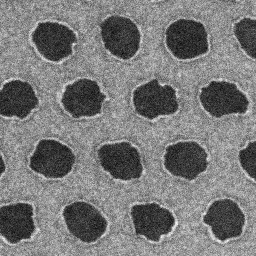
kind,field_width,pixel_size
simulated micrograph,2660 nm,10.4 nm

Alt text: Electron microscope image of a regular array of raised bodies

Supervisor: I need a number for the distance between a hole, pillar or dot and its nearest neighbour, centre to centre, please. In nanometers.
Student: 694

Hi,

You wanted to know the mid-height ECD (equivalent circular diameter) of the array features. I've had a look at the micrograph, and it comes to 456 nm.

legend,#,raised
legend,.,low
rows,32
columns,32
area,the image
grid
................................
................................
.............###......##......##
....#####...#####....#####...###
....######..######...#####...###
....#####....#####...#####....##
.....####.....###....#####....##
......##.......#......##........
................................
................................
####....####......##......###...
####....#####....#####...######.
#####...#####....#####...######.
#####...#####....#####...######.
####.....###.....####.....##....
................................
................................
.....##.........................
....#####...#####....#####....##
....#####...######..######....##
#...#####...######..######....##
#...#####....#####...#####.....#
..............###......#........
................................
................................
.###.....##......###......####..
####....#####...######....####..
####....#####...######...######.
#####...######...#####....####..
####.....####....####......###..
.#..............................
................................